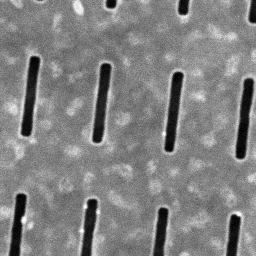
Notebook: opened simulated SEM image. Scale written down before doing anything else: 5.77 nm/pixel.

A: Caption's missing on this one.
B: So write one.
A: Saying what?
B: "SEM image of holes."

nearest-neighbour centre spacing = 412 nm